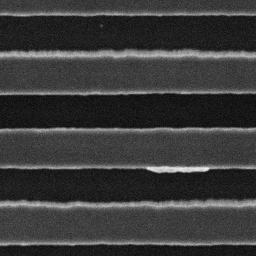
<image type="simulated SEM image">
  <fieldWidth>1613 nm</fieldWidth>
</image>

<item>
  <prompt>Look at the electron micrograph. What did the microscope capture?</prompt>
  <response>lines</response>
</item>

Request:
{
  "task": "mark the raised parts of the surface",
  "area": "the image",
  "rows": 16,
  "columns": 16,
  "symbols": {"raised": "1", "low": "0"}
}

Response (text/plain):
1111111111111111
0000000000000000
0000000000000000
1111111111111111
1111111111111111
1111111111111111
0000000000000000
0000000000000000
1111111111111111
1111111111111111
0111100001111111
0000000000000000
0000000000000000
1111111111111111
1111111111111111
0000000000000000